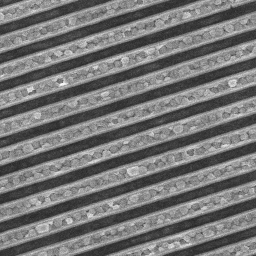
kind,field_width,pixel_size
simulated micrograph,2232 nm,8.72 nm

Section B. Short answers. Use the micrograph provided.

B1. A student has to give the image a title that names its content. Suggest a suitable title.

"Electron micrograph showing parallel lines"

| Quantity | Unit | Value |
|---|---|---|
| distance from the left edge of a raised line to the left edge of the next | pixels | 26.9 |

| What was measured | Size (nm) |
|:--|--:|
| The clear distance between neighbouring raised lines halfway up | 104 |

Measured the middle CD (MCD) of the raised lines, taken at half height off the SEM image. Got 129 nm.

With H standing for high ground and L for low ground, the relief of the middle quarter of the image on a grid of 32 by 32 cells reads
LLLLLHHHHHHHHHHHHHLLLLLLLLLHHHHH
LLHHHHHHHHHHHHHLLLLLLLLLHHHHHHHH
HHHHHHHHHHHHLLLLLLLLLHHHHHHHHHHH
HHHHHHHHLLLLLLLLLLLHHHHHHHHHHHHL
HHHHHLLLLLLLLLLHHHHHHHHHHHHHLLLL
HHLLLLLLLLLLHHHHHHHHHHHHLLLLLLLL
LLLLLLLLHHHHHHHHHHHHHLLLLLLLLLLH
LLLLLHHHHHHHHHHHHHLLLLLLLLLLHHHH
LLHHHHHHHHHHHHHLLLLLLLLLHHHHHHHH
HHHHHHHHHHHHLLLLLLLLLHHHHHHHHHHH
HHHHHHHHHLLLLLLLLLHHHHHHHHHHHHHL
HHHHHHLLLLLLLLLHHHHHHHHHHHHHLLLL
HHLLLLLLLLLLHHHHHHHHHHHHHLLLLLLL
LLLLLLLLHHHHHHHHHHHHHLLLLLLLLLLH
LLLLLLHHHHHHHHHHHHLLLLLLLLLLHHHH
LLHHHHHHHHHHHHHLLLLLLLLLHHHHHHHH
HHHHHHHHHHHHLLLLLLLLLHHHHHHHHHHH
HHHHHHHHLLLLLLLLLLHHHHHHHHHHHHHH
HHHHHLLLLLLLLLLLHHHHHHHHHHHHLLLL
HHLLLLLLLLLLHHHHHHHHHHHHHLLLLLLL
LLLLLLLLLHHHHHHHHHHHHLLLLLLLLLLH
LLLLLLHHHHHHHHHHHHLLLLLLLLLLHHHH
LLLHHHHHHHHHHHHLLLLLLLLLLHHHHHHH
HHHHHHHHHHHLLLLLLLLLLHHHHHHHHHHH
HHHHHHHHHLLLLLLLLLLHHHHHHHHHHHHL
HHHHHHLLLLLLLLLHHHHHHHHHHHHHLLLL
HHLLLLLLLLLLHHHHHHHHHHHHHLLLLLLL
LLLLLLLLLHHHHHHHHHHHHLLLLLLLLLLH
LLLLLLHHHHHHHHHHHHLLLLLLLLLHHHHH
LLLHHHHHHHHHHHHLLLLLLLLLLHHHHHHH
HHHHHHHHHHHHLLLLLLLLLLHHHHHHHHHH
HHHHHHHHHLLLLLLLLLLHHHHHHHHHHHHL